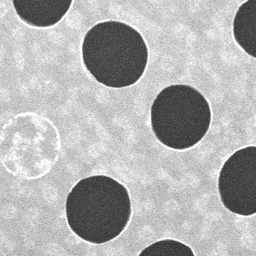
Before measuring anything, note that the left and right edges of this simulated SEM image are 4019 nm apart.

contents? holes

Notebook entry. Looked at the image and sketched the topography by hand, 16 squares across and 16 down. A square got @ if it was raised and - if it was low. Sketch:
@---@@@@@@@@@@@-
@@-@@@--@@@@@@@-
@@@@@----@@@@@@-
@@@@@----@@@@@@@
@@@@@@---@@@@@@@
@@@@@@@@@@--@@@@
@@@@@@@@@@---@@@
@@@@@@@@@----@@@
@@@@@@@@@@---@@@
@@@@@@@@@@@@@@@-
@@@@@@@@@@@@@@--
@@@@@---@@@@@@--
@@@@----@@@@@@--
@@@@----@@@@@@@@
@@@@@---@@@@@@@@
@@@@@@@@@---@@@@